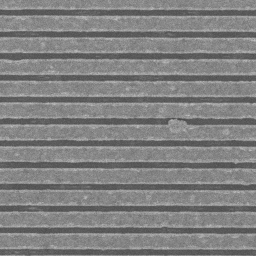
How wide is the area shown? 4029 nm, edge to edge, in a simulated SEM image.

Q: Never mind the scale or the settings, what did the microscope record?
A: parallel lines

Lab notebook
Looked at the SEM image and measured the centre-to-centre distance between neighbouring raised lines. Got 343 nm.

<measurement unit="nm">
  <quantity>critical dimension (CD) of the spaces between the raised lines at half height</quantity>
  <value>124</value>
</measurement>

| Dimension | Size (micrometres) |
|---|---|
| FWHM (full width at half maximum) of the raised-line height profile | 0.22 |